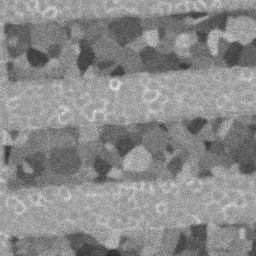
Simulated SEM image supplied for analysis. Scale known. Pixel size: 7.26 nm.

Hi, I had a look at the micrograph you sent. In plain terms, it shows one or a few lines or trenches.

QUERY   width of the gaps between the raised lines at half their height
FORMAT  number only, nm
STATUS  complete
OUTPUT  341